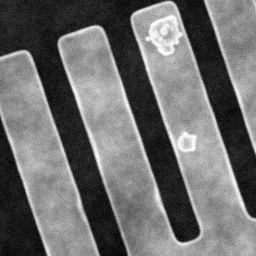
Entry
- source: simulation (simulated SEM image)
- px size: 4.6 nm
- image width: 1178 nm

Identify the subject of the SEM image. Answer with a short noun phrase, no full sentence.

groups of lines, slits or small figures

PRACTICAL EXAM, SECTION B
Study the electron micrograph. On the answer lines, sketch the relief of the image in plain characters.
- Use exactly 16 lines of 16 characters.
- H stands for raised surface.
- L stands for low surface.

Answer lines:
LLLLLLLLLHHLLHHH
LLLLLLLLHHHLLHHH
LLLLHHHLLHHHLLHH
HHLLHHHLLHHHLLHH
HHLLHHHLLHHHLLHH
HHHLLHHHLLHHHLLH
HHHLLHHHLLHHHLLH
HHHLLHHHLLHHHLLH
HHHHLLHHHLLHHHLL
LHHHLLHHHLLHHHLL
LHHHLLHHHLLHHHLL
LHHHHLLHHHLLHHHL
LLHHHLLHHHLLHHHL
LLHHHLLHHHLLHHHH
LLHHHHLLHHHLHHHH
LLLHHHLLHHHHHHHH